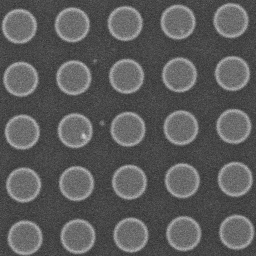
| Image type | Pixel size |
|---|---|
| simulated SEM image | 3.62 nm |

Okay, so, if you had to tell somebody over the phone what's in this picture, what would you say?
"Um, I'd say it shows an array of small figures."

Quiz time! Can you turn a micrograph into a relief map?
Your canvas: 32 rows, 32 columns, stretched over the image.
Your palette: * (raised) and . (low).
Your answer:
................................
.***....**....***....***...****.
****...****...****..****...****.
****...****...****..****...****.
.***...****...***....**.....**..
................................
................................
...............*.....**.....**..
.***...****...****...***...****.
.****..****...****..****...****.
.****..****...****...***...****.
.***....**.....**...............
................................
................................
..*.....**.....**....***....***.
.****..****...****...****..****.
.****..****...****...****..****.
.****...***...****...***....**..
..**............................
................................
............................**..
..**....***....***...****...***.
.****...****..****...****..*****
.****...****..****...****...***.
.****...***....**.....**........
................................
................................
.........*.....**.....**....***.
.****...****..****...****..*****
.****...****..****...****...****
.****...****...***...****...***.
..**.....**.....*...............